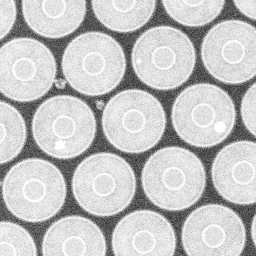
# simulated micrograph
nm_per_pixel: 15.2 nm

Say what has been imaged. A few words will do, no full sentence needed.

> an array of small figures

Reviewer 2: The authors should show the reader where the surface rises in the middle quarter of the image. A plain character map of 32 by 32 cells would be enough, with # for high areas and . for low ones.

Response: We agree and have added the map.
.....#####.....###.....####.....
.....#####.....###..............
......##......#####............#
#.............#####...........##
#............########........###
###.........##########......####
####.......####################.
#######.######......##########..
..###########.........#######...
....########...........#####....
.....######.............####....
......####..............####....
.......###.....#####.....##.....
##.....###.....#####.....##.....
##.....###.....#####.....###....
###.....##.....#####.....###....
###....###......###......###....
##.....####.............#####...
.......####.............######..
......######...........#########
......#######.........##########
.....##########.....#####.....##
...####################.........
#######.......########..........
#####..........######...........
####............#####...........
###..............###......###...
###.......#......###.....#####..
###.....####.....###.....#####..
##.....######.....##.....#####..
##.....######.....##.....####...
###.....####.....####...........